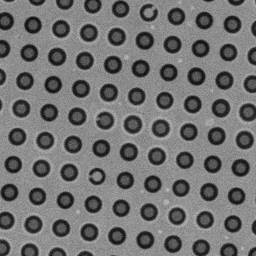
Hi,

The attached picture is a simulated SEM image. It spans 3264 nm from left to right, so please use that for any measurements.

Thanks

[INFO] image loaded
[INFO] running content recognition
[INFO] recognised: an array of small figures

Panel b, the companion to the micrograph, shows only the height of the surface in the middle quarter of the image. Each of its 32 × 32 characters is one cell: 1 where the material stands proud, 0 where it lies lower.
11100001110000011000011110001111
11110011110000111000011100001110
11111111111101111000011100001110
11111111111111111111111100001110
11100011111111111111111111111110
11000001110001111111111111111111
11000001100000111000111111111111
11000011100000110000111100011111
11100111100001110000011000011100
11111111110011110000111000001100
11111111111111111101111000011100
11000111111111111111111110111100
10000011000011111011111111111111
10000011000001100001111101111111
10000111000001100000110000111111
11101111000001100000110000011000
11111111110111100001110000011000
11111111111111110011110000111000
00001111111111111111111001111000
00000111000111111111111111111111
00000110000011000011111111111111
00001110000011000001100001111111
11011111000111000001100000110000
11111111111111000011100000110000
11111111111111111111100001110000
00011111111111111111111111110000
00001110001111111111111111111111
00001100001111000111111111111111
00011100001110000011100011111111
10111100001110000111000011110001
11111111111111000111000011100001
11111111111111111111000011100001